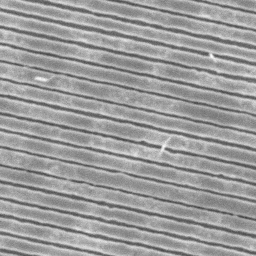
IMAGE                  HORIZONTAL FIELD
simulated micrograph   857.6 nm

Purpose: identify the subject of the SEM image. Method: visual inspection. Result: parallel lines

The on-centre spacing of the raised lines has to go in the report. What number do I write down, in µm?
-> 0.0561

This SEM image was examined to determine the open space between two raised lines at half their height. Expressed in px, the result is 3.88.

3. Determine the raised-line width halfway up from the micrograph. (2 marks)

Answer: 12.7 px